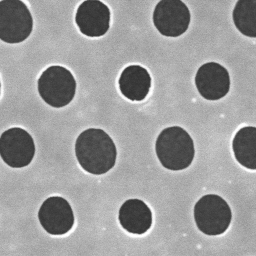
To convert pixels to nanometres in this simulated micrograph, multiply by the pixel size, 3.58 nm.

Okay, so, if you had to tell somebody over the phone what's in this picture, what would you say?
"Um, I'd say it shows a regular array of holes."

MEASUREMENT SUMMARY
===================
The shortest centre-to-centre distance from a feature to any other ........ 272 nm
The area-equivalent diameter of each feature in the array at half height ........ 136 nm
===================